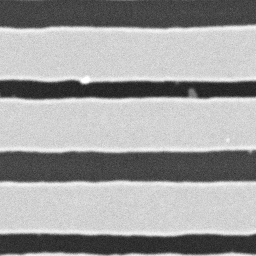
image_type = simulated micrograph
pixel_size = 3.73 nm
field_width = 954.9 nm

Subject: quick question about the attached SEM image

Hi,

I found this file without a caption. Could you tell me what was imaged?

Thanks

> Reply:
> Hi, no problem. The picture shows lines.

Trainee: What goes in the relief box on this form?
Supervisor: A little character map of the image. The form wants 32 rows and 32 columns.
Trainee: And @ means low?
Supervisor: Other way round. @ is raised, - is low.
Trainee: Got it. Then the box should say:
--------------------------------
--------------------------------
--------------------------------
------@@@@@@-------------@@@@@@@
@@@@@@@@@@@@@@@@@@@@@@@@@@@@@@@@
@@@@@@@@@@@@@@@@@@@@@@@@@@@@@@@@
@@@@@@@@@@@@@@@@@@@@@@@@@@@@@@@@
@@@@@@@@@@@@@@@@@@@@@@@@@@@@@@@@
@@@@@@@@@@@@@@@@@@@@@@@@@@@@@@@@
@@@@@@@@@@@@@@@@@@@@@@@@@@@@@@@@
--------------------------------
--------------------------------
@@@@@@@@@@@@@@@@@@@@@@@@@@@@@@@@
@@@@@@@@@@@@@@@@@@@@@@@@@@@@@@@@
@@@@@@@@@@@@@@@@@@@@@@@@@@@@@@@@
@@@@@@@@@@@@@@@@@@@@@@@@@@@@@@@@
@@@@@@@@@@@@@@@@@@@@@@@@@@@@@@@@
@@@@@@@@@@@@@@@@@@@@@@@@@@@@@@@@
@@@@@@@@@@@@@@@@@@@@@@@@@@@@@@@@
--------------------------------
--------------------------------
--------------------------------
--------------------------------
@@@@@@@@@@@@@@@@@@@@@@@@@@@@@@@@
@@@@@@@@@@@@@@@@@@@@@@@@@@@@@@@@
@@@@@@@@@@@@@@@@@@@@@@@@@@@@@@@@
@@@@@@@@@@@@@@@@@@@@@@@@@@@@@@@@
@@@@@@@@@@@@@@@@@@@@@@@@@@@@@@@@
@@@@@@@@@@@@@@@@@@@@@@@@@@@@@@@@
--------------------------------
--------------------------------
--------------------------------